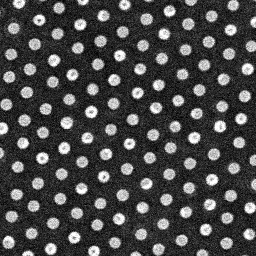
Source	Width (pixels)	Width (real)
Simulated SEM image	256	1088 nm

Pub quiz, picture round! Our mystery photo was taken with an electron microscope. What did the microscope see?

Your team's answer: a regular array of raised bodies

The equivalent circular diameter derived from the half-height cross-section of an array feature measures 48.4 nanometers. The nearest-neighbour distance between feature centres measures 98.4 nm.